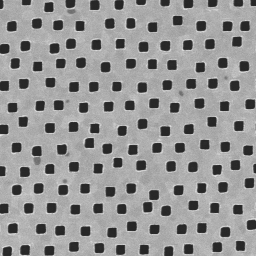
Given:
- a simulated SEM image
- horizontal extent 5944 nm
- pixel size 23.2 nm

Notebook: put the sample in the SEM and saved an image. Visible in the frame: a regular array of holes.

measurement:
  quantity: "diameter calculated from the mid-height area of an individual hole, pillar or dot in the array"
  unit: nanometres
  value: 251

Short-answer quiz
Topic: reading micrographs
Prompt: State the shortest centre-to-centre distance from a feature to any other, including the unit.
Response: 474 nanometres